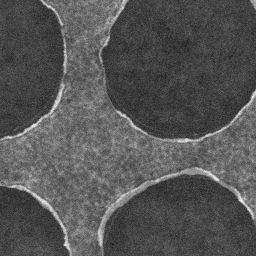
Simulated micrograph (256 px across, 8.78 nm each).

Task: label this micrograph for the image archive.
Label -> holes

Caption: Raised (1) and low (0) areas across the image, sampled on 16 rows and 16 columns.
0001111100000000
0000111000000000
0000111000000000
0000110000000000
0000111000000000
0000111000000000
0001111000000001
0011111100000011
0111111110000111
1111111111111111
1111111111111111
1111111111000011
0011111100000001
0001111000000000
0000110000000000
0000110000000000